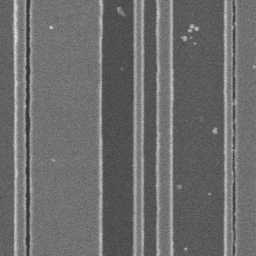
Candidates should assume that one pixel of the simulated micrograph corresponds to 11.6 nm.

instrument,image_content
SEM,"lines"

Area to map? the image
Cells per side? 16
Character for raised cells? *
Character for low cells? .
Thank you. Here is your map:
.*****..***...**
.*****..***...**
.*****..***...**
.*****..***...**
.*****..***...**
.*****..***...**
.*****..***...**
.*****..***...**
.*****..***...**
.*****..***...**
.*****..***...**
.*****..***...**
.*****..***...**
.*****..***...**
.*****..***...**
.*****..***...**